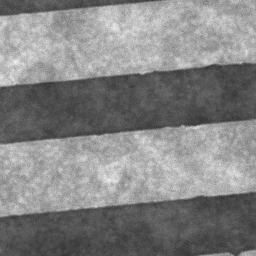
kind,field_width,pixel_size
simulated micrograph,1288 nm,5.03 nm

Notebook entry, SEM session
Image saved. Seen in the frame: one or a few lines or trenches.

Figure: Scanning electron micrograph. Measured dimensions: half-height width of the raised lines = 0.354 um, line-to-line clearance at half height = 58.6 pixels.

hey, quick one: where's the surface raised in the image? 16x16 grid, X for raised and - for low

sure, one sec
------XXXXXXXXXX
XXXXXXXXXXXXXXXX
XXXXXXXXXXXXXXXX
XXXXXXXXXXXXXXXX
XXXXXXXXX-------
----------------
----------------
----------------
-----XXXXXXXXXXX
XXXXXXXXXXXXXXXX
XXXXXXXXXXXXXXXX
XXXXXXXXXXXXXXXX
XXXXXXXXXX------
----------------
----------------
----------------